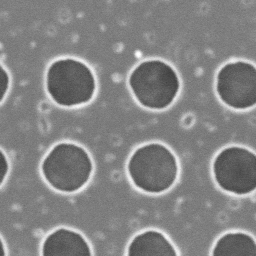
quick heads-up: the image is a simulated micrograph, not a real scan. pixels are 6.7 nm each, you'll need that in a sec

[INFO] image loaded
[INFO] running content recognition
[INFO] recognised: holes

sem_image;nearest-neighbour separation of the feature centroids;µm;0.562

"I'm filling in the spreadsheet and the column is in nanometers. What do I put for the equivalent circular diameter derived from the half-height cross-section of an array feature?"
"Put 327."